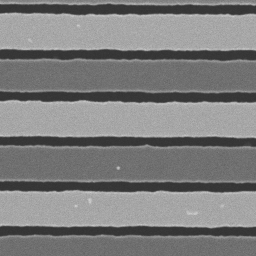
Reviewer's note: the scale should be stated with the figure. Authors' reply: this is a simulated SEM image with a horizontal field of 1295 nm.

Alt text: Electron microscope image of lines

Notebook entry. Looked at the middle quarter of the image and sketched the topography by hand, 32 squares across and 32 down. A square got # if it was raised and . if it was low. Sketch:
################################
################################
################################
################################
################################
################################
################################
................................
................................
#########.#####............#....
################################
################################
################################
################################
################################
################################
################################
################################
................................
................................
#.....#.....#...#..###........#.
################################
################################
################################
################################
################################
################################
################################
################################
............................#...
................................
................................